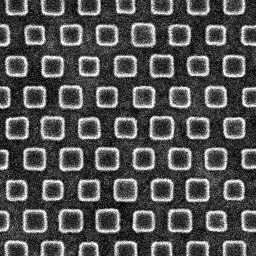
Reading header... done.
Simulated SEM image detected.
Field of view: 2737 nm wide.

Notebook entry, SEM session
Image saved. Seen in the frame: a regular array of raised bodies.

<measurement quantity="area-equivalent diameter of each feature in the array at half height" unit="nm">243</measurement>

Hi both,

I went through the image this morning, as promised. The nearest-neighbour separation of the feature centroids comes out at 0.38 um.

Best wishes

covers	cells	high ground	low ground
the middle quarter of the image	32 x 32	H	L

LLLLHHHHLLLLLHHHHHLLLLHHHHHLLLLH
LLLLHHHHLLLLLHHHHHLLLLHHHHHLLLLH
LLLLHHHHLLLLLHHHHHLLLLHHHHHLLLLL
LLLLLLLLLLLLLLLLLLLLLLLLLLLLLLLL
LLLLLLLLLLLLLLLLLLLLLLLLLLLLLLLL
LLLLLLLLLLLLLLLLLLLLLLLLLLLLLLLL
HHHHLLLLHHHHHLLLLLHHHHHLLLLHHHHL
HHHHLLLLHHHHHLLLLLHHHHHLLLLHHHHL
HHHHLLLLHHHHHLLLLHHHHHLLLLLHHHHL
HHHHLLLLHHHHHLLLLHHHHHLLLLLHHHHL
HHHHLLLLLHHHHLLLLLHHHHLLLLLHHHHL
LLLLLLLLLLLLLLLLLLLLLLLLLLLLLLLL
LLLLLLLLLLLLLLLLLLLLLLLLLLLLLLLL
LLLLLLLHLLLLLLLLLLLLLLHHHHHLLLLL
LLLLHHHHHLLLLHHHHHLLLLHHHHHLLLLH
LLLLHHHHHLLLLHHHHHLLLLHHHHHLLLLH
LLLLHHHHHLLLLHHHHHLLLLHHHHHLLLLH
LLLLHHHHHLLLLHHHHHLLLLHHHHHLLLLH
LLLLLLLLLLLLLLLLLLLLLLHHHHHLLLLL
LLLLLLLLLLLLLLLLLLLLLLLLLLLLLLLL
LLLLLLLLLLLLLLLLLLLLLLLLLLLLLLLL
HHHHLLLLHHHHHLLLLLHHHHLLLLHHHHHL
HHHHLLLLHHHHHLLLLHHHHHLLLLHHHHHL
HHHHHLLLHHHHHLLLLHHHHHLLLLHHHHHL
HHHHLLLLHHHHHLLLLHHHHHLLLLHHHHHL
HHHHLLLLHHHHHLLLLHHHHHLLLLHHHHHL
HLLLLLLLLLLLLLLLLLLLLLLLLLLLLLLL
LLLLLLLLLLLLLLLLLLLLLLLLLLLLLLLL
LLLLLLLLLLLLLLLLLLLLLLLLLLLLLLLL
LLLLHHHHLLLLLHHHHHLLLLHHHHHLLLLH
LLLLHHHHHLLLLHHHHHLLLLHHHHHLLLLH
LLLLHHHHHLLLLHHHHHLLLLHHHHHLLLLH